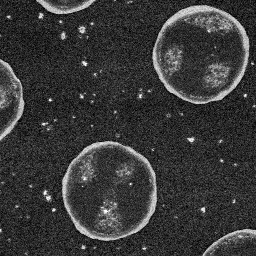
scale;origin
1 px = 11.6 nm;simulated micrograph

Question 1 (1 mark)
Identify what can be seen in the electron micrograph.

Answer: raised bodies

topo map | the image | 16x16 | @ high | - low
---@@-------@---
----------@@@@@-
----------@@@@@-
----------@@@@@-
@---------@@@@@-
@----------@@@@-
@---------------
@---------------
----------------
-----@@@--------
----@@@@@-------
----@@@@@@------
----@@@@@@------
----@@@@@-------
-----@@@-------@
-------------@@@